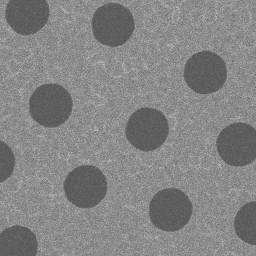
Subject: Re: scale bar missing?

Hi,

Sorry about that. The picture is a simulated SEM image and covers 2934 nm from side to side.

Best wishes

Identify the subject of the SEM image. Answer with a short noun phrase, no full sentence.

holes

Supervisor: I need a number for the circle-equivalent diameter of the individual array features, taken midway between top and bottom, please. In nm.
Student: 498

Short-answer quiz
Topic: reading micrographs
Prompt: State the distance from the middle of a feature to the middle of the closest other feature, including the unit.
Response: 84 px